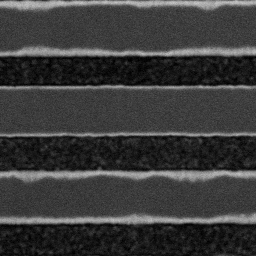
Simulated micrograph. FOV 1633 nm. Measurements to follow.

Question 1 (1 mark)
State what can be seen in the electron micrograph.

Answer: lines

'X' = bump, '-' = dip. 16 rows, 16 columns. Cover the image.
XXXXXXXXXXXXXXXX
XXXXXXXXXXXXXXXX
XXXXXXXXXXXXXXXX
X---------X-----
----------------
XXXXXXXXXXXXXXXX
XXXXXXXXXXXXXXXX
XXXXXXXXXXXXXXXX
X---------------
----------------
----------------
XXXXXXXXXXXXXXXX
XXXXXXXXXXXXXXXX
XXXXXXXXXXXXXXXX
----------------
----------------